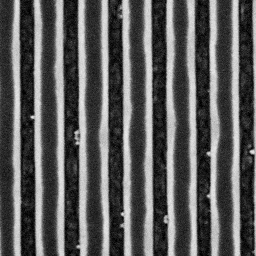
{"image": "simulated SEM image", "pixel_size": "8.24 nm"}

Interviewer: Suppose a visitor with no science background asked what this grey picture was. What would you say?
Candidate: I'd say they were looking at lines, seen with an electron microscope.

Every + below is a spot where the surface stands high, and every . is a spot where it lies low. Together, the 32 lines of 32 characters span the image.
++...++...+++...+++..+++...+++..
++...++...+++...+++..+++...+++..
++...++...+++...+++..+++...+++..
++...++...+++...+++..+++...+++..
++...++...+++...+++..+++...+++..
++...++...+++...+++..+++...+++..
++...++...+++...+++..+++...+++..
++...++...+++...+++..+++...+++..
++...++...+++...+++..+++...+++..
++...++...+++...+++..+++...+++..
++...++...+++...+++..+++...+++..
++...+++..+++...+++..+++...+++..
++...+++..+++...+++..+++...+++..
++...+++..+++...+++..+++...+++..
++...+++..+++...+++..+++...+++..
++...+++..+++...+++..+++...+++..
++...+++..+++...+++..+++...+++..
++...+++..+++...+++..+++...+++..
++...+++..+++...+++..+++...+++..
++...+++..+++...+++..+++...+++..
++...+++..+++...+++..+++...+++..
++...+++..+++...+++..+++...+++..
++...+++..+++...+++..+++...+++..
++...+++..+++...+++..+++...+++..
++...+++..+++...+++..+++...+++..
++...+++..+++...+++..+++...+++..
++...+++..+++...+++..+++...+++..
++...+++..+++...+++..+++...+++..
++...+++..+++...+++..+++...+++..
++...+++..+++...+++..+++...+++..
++...+++..+++...+++..+++...+++..
++...+++..+++...+++..+++...+++..